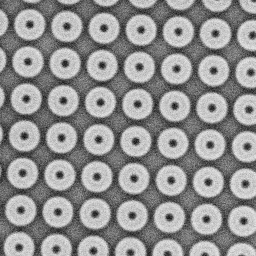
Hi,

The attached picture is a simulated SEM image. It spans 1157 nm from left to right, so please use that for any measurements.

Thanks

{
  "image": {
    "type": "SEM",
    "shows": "an array of small figures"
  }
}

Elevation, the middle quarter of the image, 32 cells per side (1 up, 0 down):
11110011111110011111111011111111
11110011111110011111110011111111
11100011111110001111110001111111
10000001111100001111110001111110
00000000000000000011000000111100
00000000000000000000000000000000
11000001111000000111000000000000
11100011111100001111100001111100
11100111111110011111110011111110
11100111111110011111110011111110
11100011111110011111110011111110
11100011111100011111110011111110
11000001111000011111100001111110
00000000000000000111000001111100
00000000000000000000000000000000
11000001110000000000000000000000
11100011111100011111000001111000
11100111111100011111100011111100
11100111111100111111110011111110
11100111111100111111110011111110
11100111111100111111110011111110
11000011111000011111100011111110
00000000110000001111000001111100
00000000000000000000000000000000
10000000000000000000000000000000
11000011111000011111000000110000
11000111111100111111100011111100
11100111111100111111100111111100
11100111111100111111100111111100
11000111111100111111100111111100
11000111111000111111100111111100
00000011110000011111000011111100